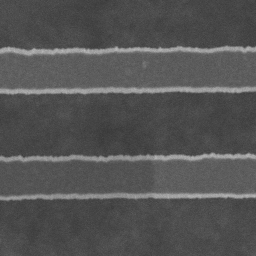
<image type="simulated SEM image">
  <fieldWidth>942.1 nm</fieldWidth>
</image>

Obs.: lines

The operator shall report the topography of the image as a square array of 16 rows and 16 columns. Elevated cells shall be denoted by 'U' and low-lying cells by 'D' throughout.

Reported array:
DDDDDDDDDDDDDDDD
DDDDDDDDDDDDDDDD
DDDDDDDDDDDDDDDD
UUUUUUUUUUUUUUUU
UUUUUUUUUUUUUUUU
UUUUUUUUUUUUUUUU
DDDDDDDDDDDDDDDD
DDDDDDDDDDDDDDDD
DDDDDDDDDDDDDDDD
DDDDDDDDDDDDDDDD
UUUUUUUUUUUUUUUU
UUUUUUUUUUUUUUUU
DDDDDDDDDDDDDDDD
DDDDDDDDDDDDDDDD
DDDDDDDDDDDDDDDD
DDDDDDDDDDDDDDDD